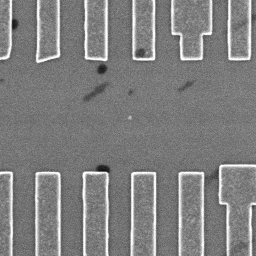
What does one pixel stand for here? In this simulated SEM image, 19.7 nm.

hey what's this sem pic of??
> wiring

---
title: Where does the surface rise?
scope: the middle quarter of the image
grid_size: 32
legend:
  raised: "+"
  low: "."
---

................................
................................
................................
................................
................................
................................
................................
................................
................................
................................
................................
................................
................................
................................
................................
................................
................................
................................
................................
................................
................................
................................
................................
................................
................................
................................
................................
.....++++++......++++++......+++
.....++++++......++++++......+++
.....++++++......++++++......+++
.....++++++......++++++......+++
.....++++++......++++++......+++